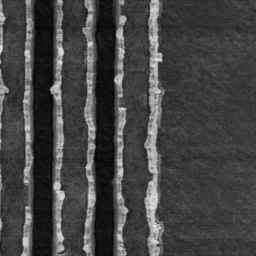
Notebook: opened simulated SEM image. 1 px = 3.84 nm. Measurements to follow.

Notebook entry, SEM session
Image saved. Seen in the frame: one or a few lines or trenches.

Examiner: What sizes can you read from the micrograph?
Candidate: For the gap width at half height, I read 89.2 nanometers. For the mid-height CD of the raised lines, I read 150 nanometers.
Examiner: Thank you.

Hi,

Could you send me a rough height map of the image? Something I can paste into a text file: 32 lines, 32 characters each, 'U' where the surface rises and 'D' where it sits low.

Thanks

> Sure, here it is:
UUUUDDDUUUUUDDDUUUUUDDDDDDDDDDDD
UUUUDDDUUUUUDDDUUUUUDDDDDDDDDDDD
UUUUDDDUUUUUDDDUUUUDDDDDDDDDDDDD
UUUUDDDUUUUUDDDUUUUDDDDDDDDDDDDD
UUUUDDDUUUUUDDDUUUUDDDDDDDDDDDDD
UUUUDDDUUUUUDDDUUUUUDDDDDDDDDDDD
UUUUDDDUUUUUDDDUUUUUDDDDDDDDDDDD
UUUUDDDUUUUUDDDUUUUUDDDDDDDDDDDD
UUUUDDDUUUUUDDDUUUUDDDDDDDDDDDDD
UUUUDDDUUUUUDDDUUUUUDDDDDDDDDDDD
UUUUDDDUUUUUDDUUUUUUDDDDDDDDDDDD
UUUUDDUUUUUUDDDUUUUUDDDDDDDDDDDD
UUUUDDDUUUUUDDDUUUUUDDDDDDDDDDDD
UUUUDDDUUUUUDDDUUUUUDDDDDDDDDDDD
UUUUDDDUUUUUDDDUUUUUDDDDDDDDDDDD
UUUUDDDUUUUUDDDUUUUDDDDDDDDDDDDD
UUUUDDDUUUUUDDDUUUUDDDDDDDDDDDDD
UUUUDDDUUUUUDDDUUUUDDDDDDDDDDDDD
UUUUDDDUUUUUDDDUUUUDDDDDDDDDDDDD
UUUUDDDUUUUUDDDUUUUDDDDDDDDDDDDD
UUUUDDDUUUUUDDDUUUUDDDDDDDDDDDDD
UUUUDDDUUUUUDDDUUUUDDDDDDDDDDDDD
UUUUDDDUUUUUDDUUUUUDDDDDDDDDDDDD
UUUUDDDUUUUUDDUUUUUDDDDDDDDDDDDD
UUUUDDDUUUUUDDDUUUUDDDDDDDDDDDDD
UUUUDDDUUUUUDDDUUUUDDDDDDDDDDDDD
UUUUDDDUUUUUDDDUUUUDDDDDDDDDDDDD
UUUUDDDUUUUUDDDUUUUDDDDDDDDDDDDD
UUUUDDDUUUUDDDDUUUUUDDDDDDDDDDDD
UUUUDDDUUUUDDDDUUUUUDDDDDDDDDDDD
UUUUDDDUUUUUDDDUUUUUDDDDDDDDDDDD
UUUUDDDUUUUUDDDUUUUUDDDDDDDDDDDD